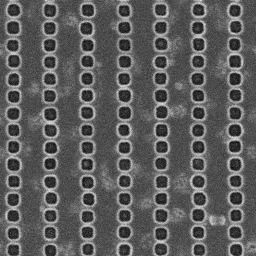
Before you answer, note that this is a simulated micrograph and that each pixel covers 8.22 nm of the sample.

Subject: a regular array of holes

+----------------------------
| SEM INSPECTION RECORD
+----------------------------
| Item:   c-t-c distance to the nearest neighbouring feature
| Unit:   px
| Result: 16.8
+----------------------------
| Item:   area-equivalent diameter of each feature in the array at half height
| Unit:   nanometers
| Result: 107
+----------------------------